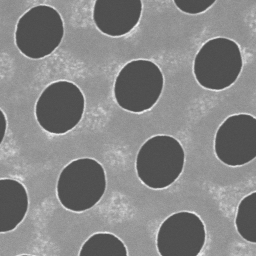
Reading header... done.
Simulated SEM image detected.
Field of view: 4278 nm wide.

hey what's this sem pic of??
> holes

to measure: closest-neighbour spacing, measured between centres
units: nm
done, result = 1320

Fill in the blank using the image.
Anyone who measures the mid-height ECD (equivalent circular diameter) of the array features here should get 838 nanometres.